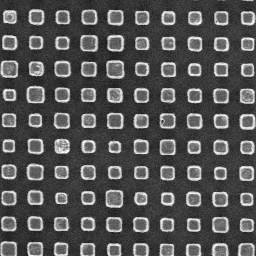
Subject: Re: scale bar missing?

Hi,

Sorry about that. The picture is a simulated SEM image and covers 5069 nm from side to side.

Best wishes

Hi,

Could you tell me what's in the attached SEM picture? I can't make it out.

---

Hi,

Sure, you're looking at a regular array of raised bodies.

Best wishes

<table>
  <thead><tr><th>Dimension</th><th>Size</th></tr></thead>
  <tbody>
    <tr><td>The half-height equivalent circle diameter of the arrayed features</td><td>285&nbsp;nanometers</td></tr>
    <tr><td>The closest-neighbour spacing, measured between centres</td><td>509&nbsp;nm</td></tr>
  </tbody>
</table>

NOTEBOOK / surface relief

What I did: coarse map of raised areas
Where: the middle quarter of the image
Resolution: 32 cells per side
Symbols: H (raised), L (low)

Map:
HLLLLHHHLLLHHHHLLLHHHLLLLHHHLLLH
HLLLLHHHLLLHHHHLLLHHHLLLLHHHLLLH
HLLLLHHHLLLHHHHLLLHHHLLLLHHHLLLL
LLLLLLLLLLLLLLLLLLLLLLLLLLLLLLLL
LLLLLLLLLLLLLLLLLLLLLLLLLLLLLLLL
LLLLLLLLLLLLLLLLLLLLLLLLLLLLLLLL
HLLLLHHLLLLHHHLLLLHHHLLLLHHLLLLH
HLLLLHHHLLLHHHLLLLHHHLLLHHHHLLLH
HLLLLHHHLLLHHHLLLLHHHLLLHHHHLLLH
LLLLLLLLLLLLLLLLLLLLLLLLLLLLLLLL
LLLLLLLLLLLLLLLLLLLLLLLLLLLLLLLL
LLLLLLLLLLLLLLLLLLLLLLLLLLLLLLLL
LLLLLLLLLLLHHHLLLLLLLLLLLHLLLLLL
HLLLLHHHLLLHHHHLLLHHHLLLHHHHLLLH
HLLLLHHHLLLHHHHLLLHHHLLLHHHHLLLH
HLLLLHHHLLLHHHHLLLHHHLLLHHHHLLLH
LLLLLLLLLLLLLLLLLLLLLLLLLLLLLLLL
LLLLLLLLLLLLLLLLLLLLLLLLLLLLLLLL
LLLLLLLLLLLLLLLLLLLLLLLLLLLLLLLL
HLLLLHHLLLLLLLLLLLHHHLLLHHHHLLLH
HLLLLHHHLLLHHHLLLLHHHLLLHHHHLLLH
HLLLLHHHLLLHHHLLLLHHHLLLHHHHLLLH
LLLLLLLLLLLLLLLLLLLLLLLLLLLLLLLL
LLLLLLLLLLLLLLLLLLLLLLLLLLLLLLLL
LLLLLLLLLLLLLLLLLLLLLLLLLLLLLLLL
LLLLLLLLLLLLLLLLLLLLLLLLLLLLLLLL
HLLLLHHHLLLHHHLLLLHHHLLLHHHLLLLH
HLLLHHHHLLLHHHLLLLHHHLLLHHHLLLLH
HLLLLHHLLLLLHHLLLLHHLLLLHHHLLLLH
LLLLLLLLLLLLLLLLLLLLLLLLLLLLLLLL
LLLLLLLLLLLLLLLLLLLLLLLLLLLLLLLL
LLLLLLLLLLLLLLLLLLLLLLLLLLLLLLLL